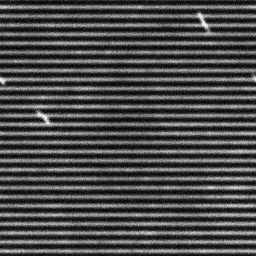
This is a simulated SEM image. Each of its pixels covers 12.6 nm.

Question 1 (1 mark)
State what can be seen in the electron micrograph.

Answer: parallel lines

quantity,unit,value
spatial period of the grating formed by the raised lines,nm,114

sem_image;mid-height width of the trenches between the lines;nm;86.9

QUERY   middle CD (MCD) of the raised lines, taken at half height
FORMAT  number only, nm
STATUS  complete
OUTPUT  22.1